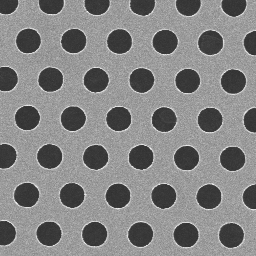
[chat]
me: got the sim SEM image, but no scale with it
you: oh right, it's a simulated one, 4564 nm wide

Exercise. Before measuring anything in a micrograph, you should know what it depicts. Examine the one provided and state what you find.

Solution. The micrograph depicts a regular array of holes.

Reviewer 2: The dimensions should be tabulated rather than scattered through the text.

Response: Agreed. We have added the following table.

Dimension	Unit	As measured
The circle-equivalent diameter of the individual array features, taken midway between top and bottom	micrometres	0.445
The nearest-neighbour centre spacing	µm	0.796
